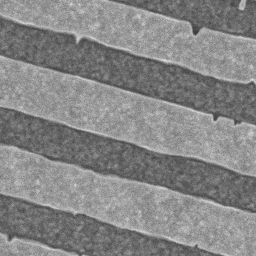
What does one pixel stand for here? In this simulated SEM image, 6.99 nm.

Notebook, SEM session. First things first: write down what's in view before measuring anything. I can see one or a few lines or trenches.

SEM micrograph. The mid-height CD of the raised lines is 331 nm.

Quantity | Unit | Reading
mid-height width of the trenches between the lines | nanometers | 260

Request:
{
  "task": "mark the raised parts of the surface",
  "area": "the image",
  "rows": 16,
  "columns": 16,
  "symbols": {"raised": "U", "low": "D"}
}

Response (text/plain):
UUUUUUUUUDDDDDDD
DUUUUUUUUUUUDDDD
DDDDDDUUUUUUUUUU
DDDDDDDDDUUUUUUU
UUUUDDDDDDDDUUUU
UUUUUUUDDDDDDDDD
UUUUUUUUUUUDDDDD
DDDUUUUUUUUUUUDD
DDDDDDDUUUUUUUUU
UUDDDDDDDDUUUUUU
UUUUUDDDDDDDDDUU
UUUUUUUUUDDDDDDD
DDUUUUUUUUUUUDDD
DDDDDDUUUUUUUUUU
DDDDDDDDDUUUUUUU
UUUDDDDDDDDDDUUU